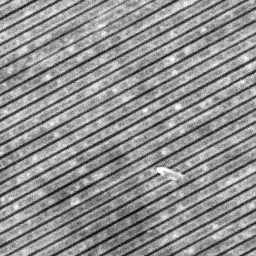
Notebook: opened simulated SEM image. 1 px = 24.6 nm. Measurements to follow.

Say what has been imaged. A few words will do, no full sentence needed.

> parallel lines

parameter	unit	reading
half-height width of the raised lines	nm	206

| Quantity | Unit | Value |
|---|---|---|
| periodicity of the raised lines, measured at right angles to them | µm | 0.274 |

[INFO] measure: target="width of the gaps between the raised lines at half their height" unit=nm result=70.5